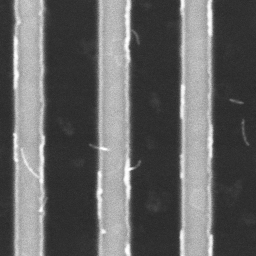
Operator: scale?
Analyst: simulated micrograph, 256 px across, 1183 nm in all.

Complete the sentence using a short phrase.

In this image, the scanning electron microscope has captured one or a few lines or trenches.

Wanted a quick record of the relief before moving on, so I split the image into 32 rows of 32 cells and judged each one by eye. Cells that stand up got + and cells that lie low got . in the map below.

++...++++++++...+++++++...++++++
++...++++++++...+++++++...++++++
++...++++++++...+++++++...++++++
++...++++++++...+++++++...++++++
++...++++++++...+++++++...++++++
++...++++++++...+++++++...++++++
++...++++++++...+++++++...++++++
++...++++++++...+++++++...++++++
++...++++++++...+++++++...++++++
++...++++++++...+++++++...++++++
++...++++++++...+++++++...++++++
++...++++++++...+++++++...++++++
++...++++++++...+++++++...++++++
++...++++++++...+++++++...++++++
++...++++++++...+++++++...++++++
++...++++++++...+++++++...++++++
++...++++++++...+++++++...++++++
++...++++++++...+++++++...++++++
++...++++++++...+++++++...++++++
++...++++++++...+++++++...++++++
++...++++++++...+++++++...++++++
++...++++++++...+++++++...++++++
++...++++++++...+++++++...++++++
++...++++++++...+++++++...++++++
++...++++++++...+++++++...++++++
++...++++++++...+++++++...++++++
++...++++++++...+++++++...++++++
++...++++++++...+++++++...++++++
++...++++++++...+++++++...++++++
++...++++++++...+++++++...++++++
++...++++++++...+++++++...++++++
++...++++++++...+++++++...++++++